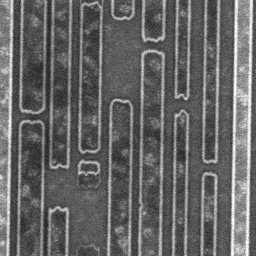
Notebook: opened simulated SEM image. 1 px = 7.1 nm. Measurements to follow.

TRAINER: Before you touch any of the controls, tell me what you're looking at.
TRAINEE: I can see parallel lines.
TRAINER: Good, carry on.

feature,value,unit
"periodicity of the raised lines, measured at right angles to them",213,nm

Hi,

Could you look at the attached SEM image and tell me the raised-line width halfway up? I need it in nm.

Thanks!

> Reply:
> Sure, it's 132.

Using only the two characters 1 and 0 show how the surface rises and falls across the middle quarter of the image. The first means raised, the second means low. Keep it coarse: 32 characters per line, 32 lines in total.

10001111100000000000111110001110
10001111100000000000111110001110
10001111100000000000111110001110
10001111100000000000111110001110
10001111100000000000111110001110
10001111100000000000111110001110
10001111100000000000111110001110
10001111100000000000111110001110
10001111100000000000111110000010
10001111100011110000111110000000
10001111100011111000111110000000
10001111100011111000111110000000
10001111100011111000111110000110
10001111100011111000111100001110
10001111100011111000111100001110
10001111100011111000111100001110
10001111100011111000111100001110
10001111100011111000111100001110
10001111100011111000111100001110
10001111100011111000111100001110
10001111100011111001111100001110
10001111000011111001111100001110
10000000000011111001111100001110
10000000000011111001111100001110
10000000000011111001111100001110
10001111000111111001111100001110
00001111100111111001111100001110
00000100000111111001111100001110
00000000000111111001111100001110
00000000000111111001111100001110
00000000000011111001111100001110
00000000000011111001111100001100